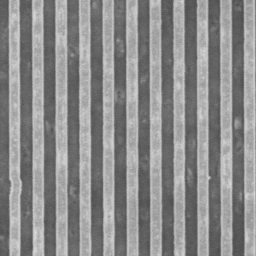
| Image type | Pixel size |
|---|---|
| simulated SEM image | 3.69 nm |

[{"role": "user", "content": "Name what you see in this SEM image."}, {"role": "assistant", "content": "parallel lines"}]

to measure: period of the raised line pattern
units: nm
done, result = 86.8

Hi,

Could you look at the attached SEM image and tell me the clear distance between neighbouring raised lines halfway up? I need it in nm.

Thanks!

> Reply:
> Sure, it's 50.2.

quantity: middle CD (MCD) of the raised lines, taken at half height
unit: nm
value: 36.9